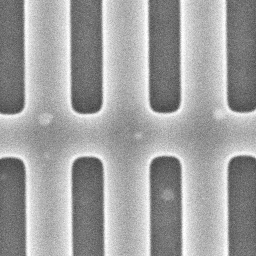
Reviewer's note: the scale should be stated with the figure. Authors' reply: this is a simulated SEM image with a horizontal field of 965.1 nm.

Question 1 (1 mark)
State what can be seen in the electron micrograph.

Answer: groups of lines, slits or small figures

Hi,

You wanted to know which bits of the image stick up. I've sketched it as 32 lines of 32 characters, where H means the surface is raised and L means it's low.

LLLHHHHHHLLLLHHHHHLLLLLHHHHHLLLL
LLLHHHHHHLLLLHHHHHLLLLLHHHHHLLLL
LLLHHHHHHLLLLHHHHHLLLLLHHHHHLLLL
LLLHHHHHHLLLLHHHHHLLLLLHHHHHLLLL
LLLHHHHHHLLLLHHHHHLLLLLHHHHHLLLL
LLLHHHHHHLLLLHHHHHLLLLLHHHHHLLLL
LLLHHHHHHLLLLHHHHHLLLLLHHHHHLLLL
LLLHHHHHHLLLLHHHHHLLLLLHHHHHLLLL
LLLHHHHHHLLLLHHHHHLLLLLHHHHHLLLL
LLLHHHHHHLLLLHHHHHLLLLLHHHHHLLLL
LLLHHHHHHLLLLHHHHHLLLLLHHHHHLLLL
LLLHHHHHHLLLLHHHHHLLLLLHHHHHLLLL
LLLHHHHHHLLLLHHHHHLLLLLHHHHHLLLL
LLLHHHHHHLLLLHHHHHHLLLLHHHHHHLLL
HHHHHHHHHHHHHHHHHHHHHHHHHHHHHHHH
HHHHHHHHHHHHHHHHHHHHHHHHHHHHHHHH
HHHHHHHHHHHHHHHHHHHHHHHHHHHHHHHH
HHHHHHHHHHHHHHHHHHHHHHHHHHHHHHHH
HHHHHHHHHHHHHHHHHHHHHHHHHHHHHHHH
HHHHHHHHHHLLHHHHHHHHLLHHHHHHHLLL
LLLHHHHHHLLLLHHHHHHLLLLHHHHHLLLL
LLLHHHHHHLLLLHHHHHHLLLLHHHHHLLLL
LLLHHHHHHLLLLHHHHHHLLLLHHHHHLLLL
LLLHHHHHHLLLLHHHHHHLLLLHHHHHLLLL
LLLHHHHHHLLLLHHHHHHLLLLHHHHHLLLL
LLLHHHHHHLLLLHHHHHHLLLLHHHHHLLLL
LLLHHHHHHLLLLHHHHHHLLLLHHHHHLLLL
LLLHHHHHHLLLLHHHHHHLLLLHHHHHLLLL
LLLHHHHHHLLLLHHHHHHLLLLHHHHHLLLL
LLLHHHHHHLLLLHHHHHHLLLLHHHHHLLLL
LLLHHHHHHLLLLHHHHHHLLLLHHHHHLLLL
LLLHHHHHHLLLLHHHHHHLLLLHHHHHLLLL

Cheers